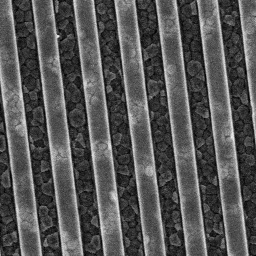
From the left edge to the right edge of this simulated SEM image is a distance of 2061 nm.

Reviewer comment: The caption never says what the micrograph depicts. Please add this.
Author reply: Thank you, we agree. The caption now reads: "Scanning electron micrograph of parallel lines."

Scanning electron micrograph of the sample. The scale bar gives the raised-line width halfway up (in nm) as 159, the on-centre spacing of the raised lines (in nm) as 330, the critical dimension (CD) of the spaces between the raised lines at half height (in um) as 0.166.